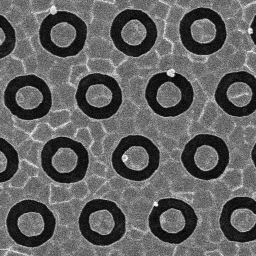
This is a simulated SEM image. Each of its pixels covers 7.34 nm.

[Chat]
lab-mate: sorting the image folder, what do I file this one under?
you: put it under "a regular array of ring-shaped grooves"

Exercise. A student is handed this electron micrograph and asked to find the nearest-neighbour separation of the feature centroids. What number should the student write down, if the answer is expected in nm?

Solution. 518